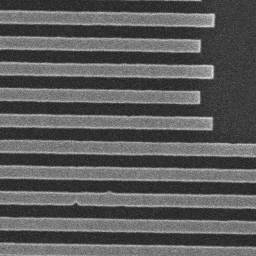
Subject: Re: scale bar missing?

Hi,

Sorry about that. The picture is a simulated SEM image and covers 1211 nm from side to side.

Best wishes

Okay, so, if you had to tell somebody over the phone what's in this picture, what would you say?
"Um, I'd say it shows parallel lines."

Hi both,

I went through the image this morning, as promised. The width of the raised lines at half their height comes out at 57.9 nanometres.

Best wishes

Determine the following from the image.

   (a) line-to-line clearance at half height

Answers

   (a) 62.1 nanometers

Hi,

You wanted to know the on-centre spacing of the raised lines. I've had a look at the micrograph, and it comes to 0.122 um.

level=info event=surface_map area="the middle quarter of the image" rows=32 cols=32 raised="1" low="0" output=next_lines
11111111111111111111111111111111
11111111111111111111111111111111
11111111111111111111111111111111
00000000000000000000000000000000
00000000000000000000000000000000
00000000000000000000000000000000
11100000000010000000000000000000
11111111111111111111111111111111
11111111111111111111111111111111
00000010110110011111111111111111
00000000000000000000000000000000
00000000000000000000000000000000
00000000000000000000000000000000
11111111111111111111111111111111
11111111111111111111111111111111
11111111111111111111111111111111
00000000000000000000000000000000
00000000000000000000000000000000
00000000000000000000000000000000
11111111111100000000000000000000
11111111111111111111111111111111
11111111111111111111111111111111
00000000000111111111110011111111
00000000000000000000000000000000
00000000000000000000000000000000
00000000000000000000000000000000
11111111111111111111111111111111
11111111111111111111111111111111
11111111111111111111111111111111
00000000000000000000000000000000
00000000000000000000000000000000
00000000000000000000000000000000